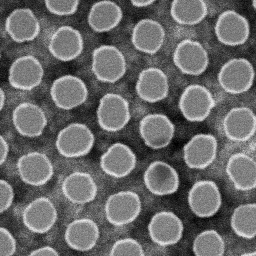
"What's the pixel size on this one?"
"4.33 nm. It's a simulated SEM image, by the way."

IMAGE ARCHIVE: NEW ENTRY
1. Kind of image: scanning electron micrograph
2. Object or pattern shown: a regular array of raised bodies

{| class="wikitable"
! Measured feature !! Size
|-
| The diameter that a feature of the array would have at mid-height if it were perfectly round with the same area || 32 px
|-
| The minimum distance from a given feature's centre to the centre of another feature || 204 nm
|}